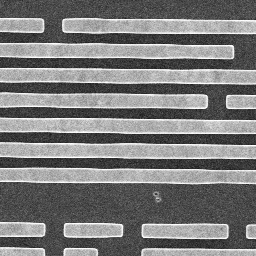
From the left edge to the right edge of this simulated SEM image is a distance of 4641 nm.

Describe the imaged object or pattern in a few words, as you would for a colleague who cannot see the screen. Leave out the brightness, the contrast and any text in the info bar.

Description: groups of lines, slits or small figures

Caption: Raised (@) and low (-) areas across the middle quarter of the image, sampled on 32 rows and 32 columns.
--------------------------------
@@@@@@@@@@@@@@@@@@@@@@@@@@@@@@@@
@@@@@@@@@@@@@@@@@@@@@@@@@@@@@@@@
@@@@@@@@@@@@@@@@@@@@@@@@@@@@@@@@
------@@@@@@@@@@@@@@@@@@@@@@@@@@
--------------------------------
--------------------------------
--------------------------------
@@@@@@@@@@@@@@@@@@@@@@@@@@@@@@@@
@@@@@@@@@@@@@@@@@@@@@@@@@@@@@@@@
@@@@@@@@@@@@@@@@@@@@@@@@@@@@@@@@
--------------------------------
--------------------------------
--------------------------------
@@@@@@@@@@@@@@@@@@@@@@@@@@@@@@@@
@@@@@@@@@@@@@@@@@@@@@@@@@@@@@@@@
@@@@@@@@@@@@@@@@@@@@@@@@@@@@@@@@
--------------------------------
--------------------------------
--------------------------------
@@@@@@@@@@@@@@@@@@@@@@@@@@@@@@@@
@@@@@@@@@@@@@@@@@@@@@@@@@@@@@@@@
@@@@@@@@@@@@@@@@@@@@@@@@@@@@@@@@
---------------------@@@@@@@@@@@
--------------------------------
--------------------------------
@@@@@@@@@@@@@@@@@@@@@@@@@@@@@@@@
@@@@@@@@@@@@@@@@@@@@@@@@@@@@@@@@
@@@@@@@@@@@@@@@@@@@@@@@@@@@@@@@@
@@@@@@@@@@@@@@@@@@@@@@@@@@@@@@@@
--------------------------------
--------------------------------